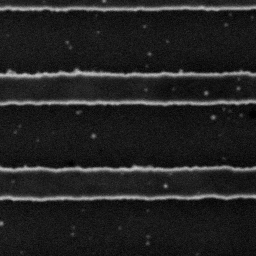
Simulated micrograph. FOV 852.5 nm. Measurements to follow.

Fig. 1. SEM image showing lines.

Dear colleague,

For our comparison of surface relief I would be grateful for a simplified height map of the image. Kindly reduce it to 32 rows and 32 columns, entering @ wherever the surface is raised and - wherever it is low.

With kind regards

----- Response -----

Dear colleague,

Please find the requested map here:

@@@@@@@@@@@@@@@@@@@@@@@@@@@@@@@@
--------------------------------
--------------------------------
--------------------------------
--------------------------------
--------------------------------
--------------------------------
--------------------------------
--------------------------------
@@@@@@@@@@@@@@@@@@@@@@@@@@@@@@@@
@@@@@@@@@@@@@@@@@@@@@@@@@@@@@@@@
@@@@@@@@@@@@@@@@@@@@@@@@@@@@@@@@
@@@@@@@@@@@@@@@@@@@@@@@@@@@@@@@@
--------------------------------
--------------------------------
--------------------------------
--------------------------------
--------------------------------
--------------------------------
--------------------------------
--------------------------------
@@@@@@@@@@@@@@@@@@@@@@@@@@@@@@@@
@@@@@@@@@@@@@@@@@@@@@@@@@@@@@@@@
@@@@@@@@@@@@@@@@@@@@@@@@@@@@@@@@
@@@@@@@@@@@@@@@@@@@@@@@@@@@@@@@@
--------------------------------
--------------------------------
--------------------------------
--------------------------------
--------------------------------
--------------------------------
--------------------------------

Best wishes